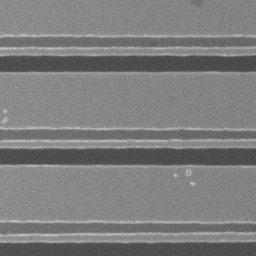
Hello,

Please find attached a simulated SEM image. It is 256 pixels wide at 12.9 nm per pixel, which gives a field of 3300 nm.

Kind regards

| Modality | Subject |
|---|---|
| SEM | lines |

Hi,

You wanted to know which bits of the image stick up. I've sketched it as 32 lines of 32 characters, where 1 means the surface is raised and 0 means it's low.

11111111111111111111111111111111
11111111111111111111111111111111
11111111111111111111111111111111
11111111111111111111111111111111
11111111111111111111111111111111
11111111111111111111111111111111
11111111111111111111111111111111
00000000000000000000000000000000
00000000000000000000000000000000
11111111111111111111111111111111
11111111111111111111111111111111
11111111111111111111111111111111
11111111111111111111111111111111
11111111111111111111111111111111
11111111111111111111111111111111
11111111111111111111111111111111
11111111111111111111111111111111
11111111111111111111111111111111
01111001111000110010011010000000
00000000000000000000000000000000
00000000000000000000000000000000
11111111111111111111111111111111
11111111111111111111111111111111
11111111111111111111111111111111
11111111111111111111111111111111
11111111111111111111111111111111
11111111111111111111111111111111
11111111111111111111111111111111
11111111111111111111111111111111
11111111111111111111111111111111
00000000000000000000000000000000
00000000000000000000000000000000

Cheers